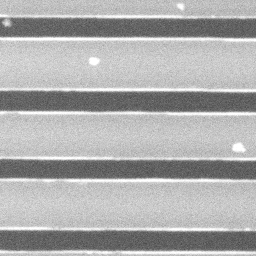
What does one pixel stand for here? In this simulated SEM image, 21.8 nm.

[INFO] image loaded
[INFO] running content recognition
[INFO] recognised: lines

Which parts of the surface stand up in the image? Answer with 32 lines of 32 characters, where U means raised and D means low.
DDDDDDDDDDDDDDDDDDDDDDDDDDDDDDDD
DDDDDDDDDDDDDDDDDDDDDDDDDDDDDDDD
UUUUUUUUUUUUUUUUUUUUUUUUUUUUUUUU
UUUUUUUUUUUUUUUUUUUUUUUUUUUUUUUU
UUUUUUUUUUUUUUUUUUUUUUUUUUUUUUUU
DDDDDDDDDDDDDDDDDDDDDDDDDDDDDDDD
DDDDDDDDDDDDDDDDDDDDDDDDDDDDDDDD
DDDDDDDDDDDDDDDDDDDDDDDDDDDDDDDD
DDDDDDDDDDDDDDDDDDDDDDDDDDDDDDDD
DDDDDDDDDDDDDDDDDDDDDDDDDDDDDDDD
DDDDDDDDDDDDDDDDDDDDDDDDDDDDDDDD
UUUUUUUUUUUUUUUUUUUUUUUUUUUUUUUU
UUUUUUUUUUUUUUUUUUUUUUUUUUUUUUUU
UUUUUUUUUUUUUUUUUUUUUUUUUUUUUUUU
DDDDDDDDDDDDDDDDDDDDDDDDDDDDDDDD
DDDDDDDDDDDDDDDDDDDDDDDDDDDDDDDD
DDDDDDDDDDDDDDDDDDDDDDDDDDDDDDDD
DDDDDDDDDDDDDDDDDDDDDDDDDDDDDDDD
DDDDDDDDDDDDDDDDDDDDDDDDDDDDDDDD
DDDDDDDDDDDDDDDDDDDDDDDDDDDDDDDD
UUUUUUUUUUUUUUUUUUUUUUUUUUUUUUUU
UUUUUUUUUUUUUUUUUUUUUUUUUUUUUUUU
DDDDDDDDDDDUUUUUUUUUUUUUUUUUUUUU
DDDDDDDDDDDDDDDDDDDDDDDDDDDDDDDD
DDDDDDDDDDDDDDDDDDDDDDDDDDDDDDDD
DDDDDDDDDDDDDDDDDDDDDDDDDDDDDDDD
DDDDDDDDDDDDDDDDDDDDDDDDDDDDDDDD
DDDDDDDDDDDDDDDDDDDDDDDDDDDDDDDD
DDDDDDDDDDDDDDDDDDDDDDDDDDDDDDDD
UUUUUUUUUUUUUUUUUUUUUUUUUUUUUUUU
UUUUUUUUUUUUUUUUUUUUUUUUUUUUUUUU
DDDDDDDDDDDDDDDDUUUUUUUUUUUUUUUU